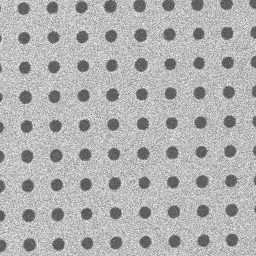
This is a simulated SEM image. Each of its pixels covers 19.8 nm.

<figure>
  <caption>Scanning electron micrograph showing a regular array of holes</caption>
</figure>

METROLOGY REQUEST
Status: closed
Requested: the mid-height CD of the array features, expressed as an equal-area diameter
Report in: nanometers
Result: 246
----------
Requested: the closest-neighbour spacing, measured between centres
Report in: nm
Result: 571